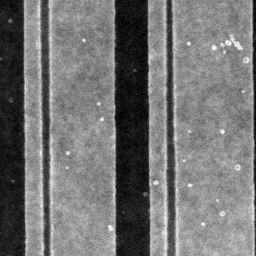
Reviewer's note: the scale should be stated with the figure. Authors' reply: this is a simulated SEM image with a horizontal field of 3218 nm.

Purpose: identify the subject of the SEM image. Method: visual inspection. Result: lines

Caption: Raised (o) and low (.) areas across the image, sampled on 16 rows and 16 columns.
..ooooo..ooooooo
..ooooo..ooooooo
..ooooo..ooooooo
..ooooo..ooooooo
..ooooo..ooooooo
..ooooo..ooooooo
..ooooo..ooooooo
..ooooo..ooooooo
..ooooo..ooooooo
..ooooo..ooooooo
..ooooo..ooooooo
..ooooo..ooooooo
..ooooo..ooooooo
..ooooo..ooooooo
..ooooo..ooooooo
..ooooo..ooooooo